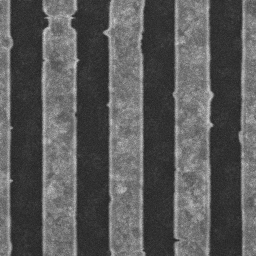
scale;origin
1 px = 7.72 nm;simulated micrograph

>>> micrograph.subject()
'one or a few lines or trenches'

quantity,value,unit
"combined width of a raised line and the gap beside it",512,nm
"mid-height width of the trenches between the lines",266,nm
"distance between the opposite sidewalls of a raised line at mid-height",241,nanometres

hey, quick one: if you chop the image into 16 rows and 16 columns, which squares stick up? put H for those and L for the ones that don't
HLLHHLLHHLLHHLLH
HLLHLLLHHLLHHLLH
HLLHHLLHHLLHHLLH
HLLHHLLHHLLHHLLH
HLLHHLLHHLLHHLLH
HLLHHLLHHLLHHLLH
HLLHHLLHHLLHHLLH
HLLHHLLHHLLHHLLH
HLLHHLLHHLLHHLLH
HLLHHLLHHLLHHLLH
HLLHHLLHHLLHHLLH
HLLHHLLHHLLHHLLH
HLLHHLLHHLLHHLLH
HLLHHLLHHLLHHLLH
HLLHHLLHHLLHHLLH
HLLHHLLHHLLHHLLH